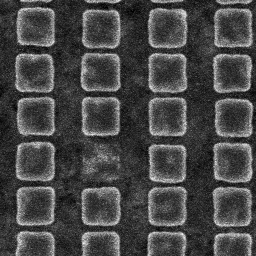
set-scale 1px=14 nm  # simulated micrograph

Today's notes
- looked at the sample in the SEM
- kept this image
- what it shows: a regular array of raised bodies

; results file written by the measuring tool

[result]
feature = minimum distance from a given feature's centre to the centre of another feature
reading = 44.1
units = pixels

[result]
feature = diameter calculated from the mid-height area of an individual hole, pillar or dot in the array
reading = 574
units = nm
